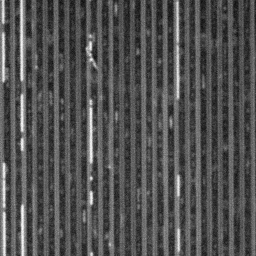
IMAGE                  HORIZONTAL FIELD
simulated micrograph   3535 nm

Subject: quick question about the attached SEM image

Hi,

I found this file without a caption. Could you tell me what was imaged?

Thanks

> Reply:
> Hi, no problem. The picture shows parallel lines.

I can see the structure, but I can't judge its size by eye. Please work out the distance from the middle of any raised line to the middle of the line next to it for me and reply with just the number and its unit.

151 nanometers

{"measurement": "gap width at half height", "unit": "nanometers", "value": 104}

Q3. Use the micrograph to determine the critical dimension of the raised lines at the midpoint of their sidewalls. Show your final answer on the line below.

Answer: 51.8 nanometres